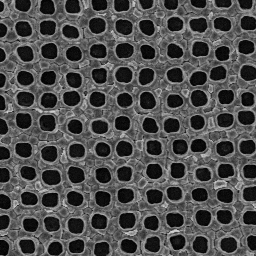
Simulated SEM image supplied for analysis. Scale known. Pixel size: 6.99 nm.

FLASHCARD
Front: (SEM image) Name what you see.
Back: a regular array of holes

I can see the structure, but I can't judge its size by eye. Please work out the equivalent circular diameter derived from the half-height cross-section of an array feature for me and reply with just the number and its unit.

116 nanometers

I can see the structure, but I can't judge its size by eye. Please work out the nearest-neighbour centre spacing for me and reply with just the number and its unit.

22.5 px